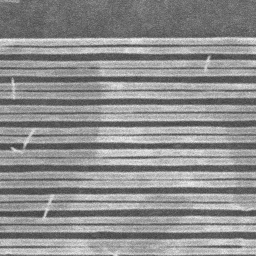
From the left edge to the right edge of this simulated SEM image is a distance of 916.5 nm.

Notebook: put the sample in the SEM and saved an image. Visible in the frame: parallel lines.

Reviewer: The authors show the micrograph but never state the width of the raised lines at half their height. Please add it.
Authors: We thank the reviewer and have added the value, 22.8 nanometers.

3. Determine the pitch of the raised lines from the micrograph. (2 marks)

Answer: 39.4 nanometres